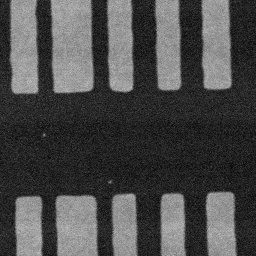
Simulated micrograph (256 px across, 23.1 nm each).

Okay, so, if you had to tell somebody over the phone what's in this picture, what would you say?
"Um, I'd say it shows groups of lines, slits or small figures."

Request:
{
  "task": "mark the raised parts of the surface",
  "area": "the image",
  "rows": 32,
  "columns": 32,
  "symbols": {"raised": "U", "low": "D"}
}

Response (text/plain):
DUUUDDUUUUUDDDUUDDDDUUDDDUUUUDDD
DUUUDDUUUUUDDDUUDDDDUUDDDUUUUDDD
DUUUDDDUUUUDDDUUDDDDUUDDDUUUUDDD
DUUUDDDUUUUDDDUUDDDDUUDDDUUUUDDD
DUUUDDDUUUUDDDUUDDDDUUDDDUUUUDDD
DUUUUDDUUUUDDDUUDDDDUUDDDUUUUDDD
DUUUUDDUUUUDDDUUDDDDUUDDDUUUUDDD
DUUUUDDUUUUUDDUUDDDDUUDDDUUUUDDD
DDUUUDDUUUUUDDUUUDDDUUDDDUUUUDDD
DDUUUDDUUUUUDDUUUDDDUUUDDDUUUDDD
DDUUUDDUUUUUDDUUUDDDUUUDDDUUUDDD
DDUUDDDDDDDDDDDDDDDDDDDDDDDDDDDD
DDDDDDDDDDDDDDDDDDDDDDDDDDDDDDDD
DDDDDDDDDDDDDDDDDDDDDDDDDDDDDDDD
DDDDDDDDDDDDDDDDDDDDDDDDDDDDDDDD
DDDDDDDDDDDDDDDDDDDDDDDDDDDDDDDD
DDDDDDDDDDDDDDDDDDDDDDDDDDDDDDDD
DDDDDDDDDDDDDDDDDDDDDDDDDDDDDDDD
DDDDDDDDDDDDDDDDDDDDDDDDDDDDDDDD
DDDDDDDDDDDDDDDDDDDDDDDDDDDDDDDD
DDDDDDDDDDDDDDDDDDDDDDDDDDDDDDDD
DDDDDDDDDDDDDDDDDDDDDDDDDDDDDDDD
DDDDDDDDDDDDDDDDDDDDDDDDDDDDDDDD
DDDDDDDDDDDDDDDDDDDDDDDDDDDDDDDD
DDDDDDDDDDDDDDDUUDDDDUUDDDUUUDDD
DDUUUDDUUUUUDDUUUDDDUUUDDDUUUDDD
DDUUUDDUUUUUDDUUUDDDUUUDDDUUUDDD
DDUUUDDUUUUUDDUUUDDDUUUDDDUUUDDD
DDUUUDDUUUUUDDUUUDDDUUUDDDUUUDDD
DDUUUDDUUUUUDDUUUDDDUUUDDDUUUDDD
DDUUUDDUUUUUDDUUUDDDUUUDDDUUUDDD
DDUUUDDUUUUUDDUUUDDDUUUDDDUUUDDD